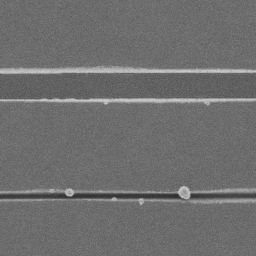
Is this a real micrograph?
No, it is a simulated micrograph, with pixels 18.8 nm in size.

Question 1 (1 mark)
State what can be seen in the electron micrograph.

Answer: lines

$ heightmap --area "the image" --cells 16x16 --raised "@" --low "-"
@@@@@@@@@@@@@@@@
@@@@@@@@@@@@@@@@
@@@@@@@@@@@@@@@@
@@@@@@@@@@@@@@@@
----------------
----------------
@@@@@@@@@@@@@@@@
@@@@@@@@@@@@@@@@
@@@@@@@@@@@@@@@@
@@@@@@@@@@@@@@@@
@@@@@@@@@@@@@@@@
@@@@@@@@@@@@@@@@
@@@@@@@@@@@@@@@@
@@@@@@@@@@@@@@@@
@@@@@@@@@@@@@@@@
@@@@@@@@@@@@@@@@